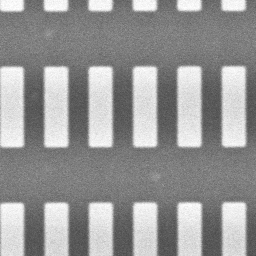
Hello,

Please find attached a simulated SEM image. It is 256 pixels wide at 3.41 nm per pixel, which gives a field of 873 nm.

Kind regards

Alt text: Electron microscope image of groups of lines, slits or small figures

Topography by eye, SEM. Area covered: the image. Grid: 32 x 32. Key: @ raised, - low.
@@@---@@---@@@---@@---@@@---@@@-
--------------------------------
--------------------------------
--------------------------------
--------------------------------
--------------------------------
--------------------------------
--------------------------------
------------------@----@@---@@--
@@@---@@---@@@---@@---@@@---@@@-
@@@---@@---@@@---@@---@@@---@@@-
@@@---@@---@@@---@@---@@@---@@@-
@@@---@@---@@@---@@---@@@---@@@-
@@@---@@---@@@---@@---@@@---@@@-
@@@---@@---@@@---@@---@@@---@@@-
@@@---@@---@@@---@@@--@@@---@@@-
@@@---@@---@@@---@@@--@@@---@@@-
@@@---@@---@@@---@@@--@@@---@@@-
--------------------------------
--------------------------------
--------------------------------
--------------------------------
--------------------------------
--------------------------------
--------------------------------
------@@----@@---@@----@@---@@--
@@@---@@---@@@---@@@--@@@---@@@-
@@@---@@---@@@---@@@--@@@---@@@-
@@@---@@---@@@---@@@--@@@---@@@-
@@@---@@---@@@---@@@--@@@---@@@-
@@@---@@---@@@---@@@--@@@---@@@-
@@@---@@---@@@---@@@--@@@---@@@-